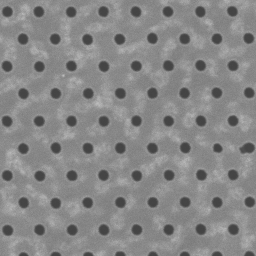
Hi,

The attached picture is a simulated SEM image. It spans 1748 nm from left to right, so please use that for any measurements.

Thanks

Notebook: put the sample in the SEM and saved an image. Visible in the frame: a regular array of holes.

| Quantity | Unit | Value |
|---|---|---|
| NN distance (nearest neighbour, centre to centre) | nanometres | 214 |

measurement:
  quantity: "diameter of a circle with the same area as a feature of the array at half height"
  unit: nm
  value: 77.6